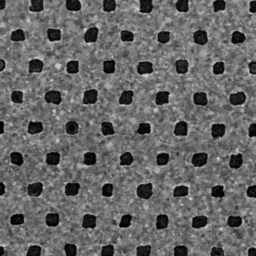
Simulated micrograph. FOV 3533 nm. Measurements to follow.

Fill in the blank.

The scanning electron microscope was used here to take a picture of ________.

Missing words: a regular array of holes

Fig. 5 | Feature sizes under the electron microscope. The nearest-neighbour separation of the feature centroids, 482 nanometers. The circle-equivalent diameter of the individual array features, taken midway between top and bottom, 210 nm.